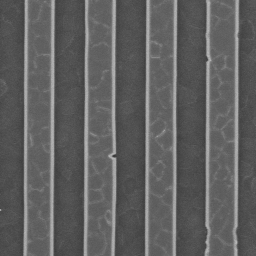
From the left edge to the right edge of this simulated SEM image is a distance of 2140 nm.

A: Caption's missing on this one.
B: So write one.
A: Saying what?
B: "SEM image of one or a few lines or trenches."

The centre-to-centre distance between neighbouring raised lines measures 510 nanometres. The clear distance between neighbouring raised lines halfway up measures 279 nanometres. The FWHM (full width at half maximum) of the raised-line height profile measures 0.231 microns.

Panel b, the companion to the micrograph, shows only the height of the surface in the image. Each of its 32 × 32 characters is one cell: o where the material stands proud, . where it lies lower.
...oooo....ooo.....ooo....oooo..
...oooo....ooo.....ooo....oooo..
...oooo....ooo.....ooo....oooo..
...oooo....ooo.....ooo....oooo..
...oooo....ooo.....ooo....oooo..
...oooo....ooo.....ooo....oooo..
...oooo....ooo.....ooo....oooo..
...oooo....ooo.....ooo....oooo..
...oooo....ooo.....ooo....oooo..
...oooo....ooo....oooo....oooo..
...oooo....ooo....oooo....oooo..
...oooo....ooo....oooo....oooo..
...oooo....ooo....oooo....oooo..
...oooo....ooo....oooo....oooo..
...oooo....ooo....oooo....oooo..
...oooo....ooo....oooo....oooo..
...oooo....ooo....oooo....oooo..
...oooo....ooo....oooo....oooo..
...oooo....ooo....oooo....oooo..
...oooo....ooo....oooo....oooo..
...oooo....ooo....oooo....oooo..
...ooo.....ooo....oooo....oooo..
...ooo.....ooo....oooo....oooo..
...ooo.....ooo....oooo....oooo..
...ooo.....ooo....oooo....ooo...
...ooo.....ooo....oooo....ooo...
...ooo.....ooo....oooo....ooo...
...ooo.....ooo....oooo....ooo...
...ooo.....ooo....oooo....ooo...
...ooo.....ooo....oooo....ooo...
...ooo.....ooo....oooo....ooo...
...ooo.....ooo....oooo....ooo...